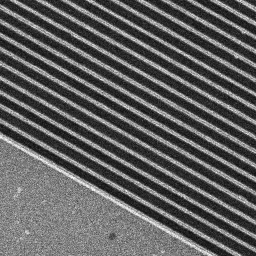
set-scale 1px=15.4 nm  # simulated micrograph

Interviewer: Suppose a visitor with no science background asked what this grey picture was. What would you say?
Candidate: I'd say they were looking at parallel lines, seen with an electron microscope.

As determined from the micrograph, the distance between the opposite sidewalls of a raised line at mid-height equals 0.0737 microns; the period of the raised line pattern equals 190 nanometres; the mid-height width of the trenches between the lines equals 117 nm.